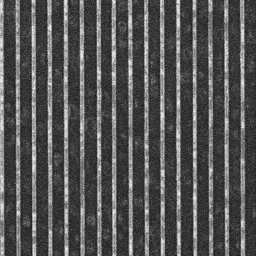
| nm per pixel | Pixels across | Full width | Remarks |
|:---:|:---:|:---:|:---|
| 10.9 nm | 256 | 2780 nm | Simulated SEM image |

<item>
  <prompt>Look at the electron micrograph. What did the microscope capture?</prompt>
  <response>parallel lines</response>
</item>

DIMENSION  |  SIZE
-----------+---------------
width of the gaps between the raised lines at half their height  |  132 nm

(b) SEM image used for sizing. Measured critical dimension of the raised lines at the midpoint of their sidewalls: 40.7 nanometers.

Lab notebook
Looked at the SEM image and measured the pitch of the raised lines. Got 174 nanometres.